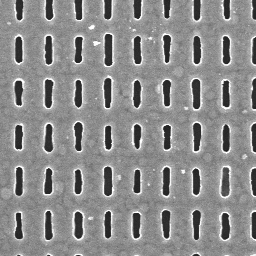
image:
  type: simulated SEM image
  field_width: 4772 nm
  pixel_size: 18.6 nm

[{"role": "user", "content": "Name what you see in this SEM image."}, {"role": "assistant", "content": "a regular array of holes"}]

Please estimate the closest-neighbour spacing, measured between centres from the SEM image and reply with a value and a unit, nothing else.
548 nm